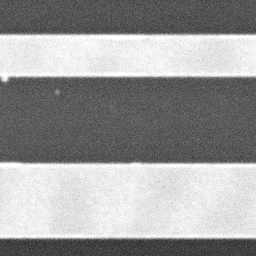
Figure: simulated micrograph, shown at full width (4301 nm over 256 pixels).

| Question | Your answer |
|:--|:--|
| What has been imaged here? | lines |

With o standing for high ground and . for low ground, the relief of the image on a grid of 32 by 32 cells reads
................................
................................
................................
................................
................................
oooooooooooooooooooooooooooooooo
oooooooooooooooooooooooooooooooo
oooooooooooooooooooooooooooooooo
oooooooooooooooooooooooooooooooo
................................
................................
................................
................................
................................
................................
................................
................................
................................
................................
................................
................................
oooooooooooooooooooooooooooooooo
oooooooooooooooooooooooooooooooo
oooooooooooooooooooooooooooooooo
oooooooooooooooooooooooooooooooo
oooooooooooooooooooooooooooooooo
oooooooooooooooooooooooooooooooo
oooooooooooooooooooooooooooooooo
oooooooooooooooooooooooooooooooo
oooooooooooooooooooooooooooooooo
................................
................................